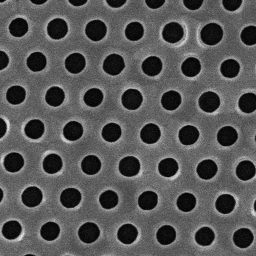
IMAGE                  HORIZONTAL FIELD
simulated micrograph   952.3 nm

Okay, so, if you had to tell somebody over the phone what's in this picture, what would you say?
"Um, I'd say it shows a regular array of holes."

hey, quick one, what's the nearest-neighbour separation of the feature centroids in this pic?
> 143 nm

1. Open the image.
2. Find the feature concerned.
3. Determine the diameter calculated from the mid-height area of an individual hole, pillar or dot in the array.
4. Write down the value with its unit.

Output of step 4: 0.0759 um